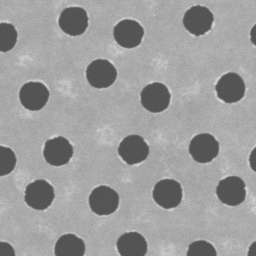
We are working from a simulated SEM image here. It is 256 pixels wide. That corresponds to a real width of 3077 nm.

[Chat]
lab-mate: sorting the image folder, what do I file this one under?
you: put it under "a regular array of holes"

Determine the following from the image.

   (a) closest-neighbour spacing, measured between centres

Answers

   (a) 668 nanometers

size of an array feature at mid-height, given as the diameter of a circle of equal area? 360 nm